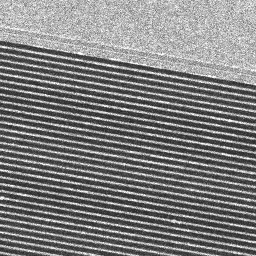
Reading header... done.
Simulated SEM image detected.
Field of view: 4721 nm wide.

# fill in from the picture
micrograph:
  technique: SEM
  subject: parallel lines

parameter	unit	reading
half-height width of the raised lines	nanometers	47.7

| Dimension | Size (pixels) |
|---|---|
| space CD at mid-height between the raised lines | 4.31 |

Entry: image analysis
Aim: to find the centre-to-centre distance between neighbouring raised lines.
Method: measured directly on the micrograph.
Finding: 125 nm